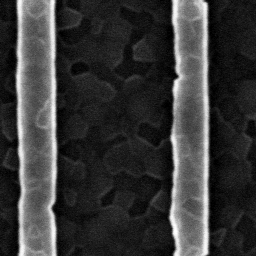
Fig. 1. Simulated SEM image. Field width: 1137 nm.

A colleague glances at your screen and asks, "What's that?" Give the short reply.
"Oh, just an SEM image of one or a few lines or trenches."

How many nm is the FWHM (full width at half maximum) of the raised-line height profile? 145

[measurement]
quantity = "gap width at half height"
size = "0.536 microns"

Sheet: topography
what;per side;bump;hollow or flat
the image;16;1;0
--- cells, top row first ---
0110000000011000
0110000000011000
0110000000011000
0110000000011000
0110000000011000
0110000000011000
0110000000011000
0110000000011000
0110000000011000
0110000000011000
0110000000011000
0110000000011000
0110000000011000
0110000000011000
0110000000011000
0110000000011000